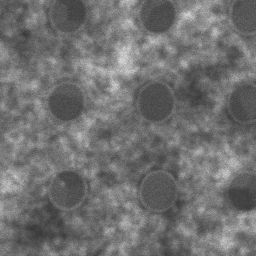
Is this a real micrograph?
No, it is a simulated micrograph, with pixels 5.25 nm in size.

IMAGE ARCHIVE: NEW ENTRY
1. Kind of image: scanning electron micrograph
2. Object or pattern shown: raised bodies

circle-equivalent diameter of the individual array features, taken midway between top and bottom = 207 nanometres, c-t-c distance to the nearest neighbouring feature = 462 nm